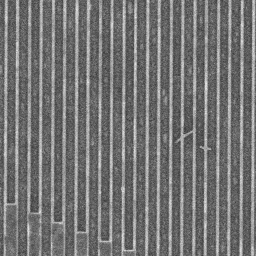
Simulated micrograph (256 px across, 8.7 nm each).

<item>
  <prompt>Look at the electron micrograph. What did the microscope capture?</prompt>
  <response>parallel lines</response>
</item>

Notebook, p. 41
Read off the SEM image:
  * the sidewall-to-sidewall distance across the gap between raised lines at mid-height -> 0.0837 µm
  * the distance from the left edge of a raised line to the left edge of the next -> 102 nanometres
